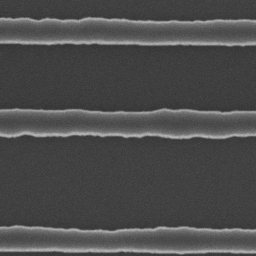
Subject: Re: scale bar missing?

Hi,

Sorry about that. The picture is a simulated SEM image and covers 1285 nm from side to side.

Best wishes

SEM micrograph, lines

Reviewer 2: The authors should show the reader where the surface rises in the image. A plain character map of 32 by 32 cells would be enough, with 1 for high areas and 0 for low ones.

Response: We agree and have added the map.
00000000000000000000000000000000
00000000000000000000000000000000
11110111001111110000000000000000
11111111111111111111111111111111
11111111111111111111111111111111
00000000000000000111110011111111
00000000000000000000000000000000
00000000000000000000000000000000
00000000000000000000000000000000
00000000000000000000000000000000
00000000000000000000000000000000
00000000000000000000000000000000
00000000000000000000000000000000
00000000000000000000000000000000
11111111111111111111111111111111
11111111111111111111111111111111
11111111111111111111111111111111
00000000000000000000000000000000
00000000000000000000000000000000
00000000000000000000000000000000
00000000000000000000000000000000
00000000000000000000000000000000
00000000000000000000000000000000
00000000000000000000000000000000
00000000000000000000000000000000
00000000000000000000000000000000
00000000000000000000000000000000
00000000000000000000000000000000
11111100000000000000101100000000
11111111111111111111111111111111
11111111111111111111111111111111
00000000000000000001111111000111